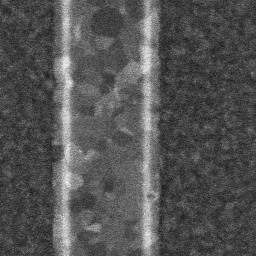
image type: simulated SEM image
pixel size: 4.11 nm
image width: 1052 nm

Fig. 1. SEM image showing one or a few lines or trenches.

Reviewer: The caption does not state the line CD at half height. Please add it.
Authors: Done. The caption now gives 333 nm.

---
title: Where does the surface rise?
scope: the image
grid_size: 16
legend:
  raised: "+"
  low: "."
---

....+++++.......
....+++++.......
....+++++.......
....+++++.......
....+++++.......
....+++++.......
....+++++.......
....+++++.......
....+++++.......
....+++++.......
....+++++.......
....+++++.......
....+++++.......
....+++++.......
....+++++.......
....+++++.......